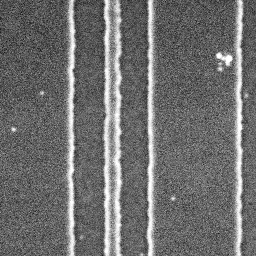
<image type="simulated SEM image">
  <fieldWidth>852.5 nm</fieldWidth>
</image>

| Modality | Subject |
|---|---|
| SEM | lines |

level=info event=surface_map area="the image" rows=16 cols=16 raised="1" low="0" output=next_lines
1111100001111110
1111100001111110
1111100001111110
1111100001111110
1111100001111110
1111100001111110
1111100001111110
1111100001111110
1111100001111110
1111100001111110
1111100001111110
1111000001111110
1111100001111110
1111100001111110
1111100001111110
1111100001111110